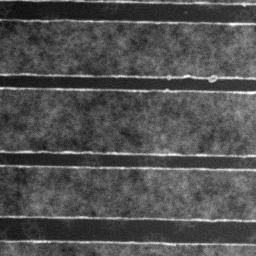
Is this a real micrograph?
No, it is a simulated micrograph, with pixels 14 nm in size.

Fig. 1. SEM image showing one or a few lines or trenches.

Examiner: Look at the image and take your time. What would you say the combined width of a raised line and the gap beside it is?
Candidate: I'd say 1010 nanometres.